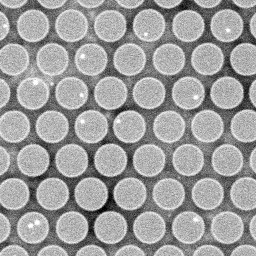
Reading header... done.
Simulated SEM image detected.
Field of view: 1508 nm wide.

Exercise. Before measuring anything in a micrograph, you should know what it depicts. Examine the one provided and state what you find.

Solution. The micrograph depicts an array of small figures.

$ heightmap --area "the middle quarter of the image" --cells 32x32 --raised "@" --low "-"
@--@@@@@@@---@@@@@@@---@@@@@@@--
----@@@@@@---@@@@@@----@@@@@@---
-----@@@-------@@@-------@@@----
-@@-------@@@-----------------@@
@@@@@----@@@@@@----@@@@@----@@@@
@@@@@---@@@@@@@---@@@@@@@---@@@@
@@@@@@--@@@@@@@@-@@@@@@@@--@@@@@
@@@@@@--@@@@@@@@-@@@@@@@@--@@@@@
@@@@@@--@@@@@@@--@@@@@@@@--@@@@@
@@@@@---@@@@@@@---@@@@@@----@@@@
@@@@-----@@@@@-----@@@@@-----@@@
--------------------------------
----@@@@@-----@@@@@-----@@@@----
---@@@@@@@---@@@@@@@---@@@@@@---
@--@@@@@@@@--@@@@@@@---@@@@@@@--
@--@@@@@@@@-@@@@@@@@---@@@@@@@--
@--@@@@@@@@--@@@@@@@---@@@@@@@--
---@@@@@@@---@@@@@@@---@@@@@@@--
----@@@@@@----@@@@@-----@@@@@---
------@@------------------------
@@@-------@@@-------@@@------@@@
@@@@@----@@@@@@---@@@@@@----@@@@
@@@@@@--@@@@@@@---@@@@@@@--@@@@@
@@@@@@--@@@@@@@--@@@@@@@@--@@@@@
@@@@@@--@@@@@@@@-@@@@@@@@--@@@@@
@@@@@@--@@@@@@@---@@@@@@@---@@@@
@@@@@---@@@@@@@---@@@@@@----@@@@
@@@@------@@@@-----@@@@-------@@
--------------------------------
----@@@@@-----@@@@@-----@@@@@---
@--@@@@@@@---@@@@@@@---@@@@@@@--
@--@@@@@@@@--@@@@@@@--@@@@@@@@--